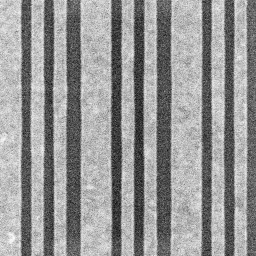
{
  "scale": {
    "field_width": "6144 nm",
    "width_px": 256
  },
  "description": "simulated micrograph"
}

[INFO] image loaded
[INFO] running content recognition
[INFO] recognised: wiring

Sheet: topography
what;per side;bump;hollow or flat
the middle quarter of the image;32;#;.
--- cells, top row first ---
....#######....##...###....#####
....#######....##...###....#####
....#######....##...###....#####
....########...##...###....#####
#...########...##...###....#####
#...########...##...###....#####
#...########...##...###....#####
#...########...##...###....#####
#...#######....##...###....#####
#...#######....##...###....#####
....#######....##...###....#####
....#######....##...###....#####
....#######....##...###....#####
.....######....##...###....#####
.....######...###...###....#####
.....######...###...###....#####
.....######....##...###....#####
....#######....##...###....#####
....#######....##...###....#####
....#######....##...###....#####
....#######....##...###....#####
....#######....##...###....#####
....#######....##...###....#####
....#######....##...###....#####
....#######....##...###....#####
....#######....##...###....#####
....#######....##...###....#####
....#######....##...###....#####
....########...##...###....#####
....########...##...###....#####
....########...##...###....#####
....########...##...###....#####